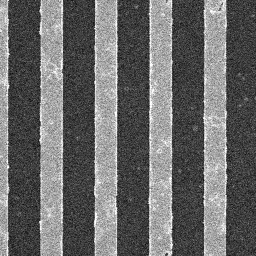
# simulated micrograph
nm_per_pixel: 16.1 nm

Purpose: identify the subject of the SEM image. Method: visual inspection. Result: parallel lines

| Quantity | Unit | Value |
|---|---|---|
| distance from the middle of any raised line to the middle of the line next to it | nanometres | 878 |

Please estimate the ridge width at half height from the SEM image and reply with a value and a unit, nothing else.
0.346 micrometres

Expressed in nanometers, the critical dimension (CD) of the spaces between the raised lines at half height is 529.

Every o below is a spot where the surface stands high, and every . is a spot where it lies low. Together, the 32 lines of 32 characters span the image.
o....ooo....ooo....oo.....oo....
o....ooo....ooo....oo.....oo....
o....ooo....ooo....ooo....oo....
o....ooo....ooo....oo.....oo....
o....ooo....ooo....oo.....oo....
o....ooo....ooo....oo.....oo....
o....ooo....ooo....oo.....oo....
o....ooo....ooo....oo.....oo....
o....ooo....ooo....oo.....oo....
o....ooo....ooo....oo.....oo....
o....ooo....ooo....oo.....oo....
o....ooo....ooo....oo.....oo....
o....ooo....ooo....oo.....oo....
o....ooo....ooo....oo.....oo....
o....ooo....ooo....oo....ooo....
o....ooo....ooo....oo.....oo....
o....ooo....ooo....oo.....oo....
o....ooo....ooo....oo.....oo....
o....ooo....ooo....oo.....oo....
o....ooo....ooo....oo.....oo....
o....ooo....ooo....oo.....oo....
o....ooo....ooo....oo.....oo....
o....ooo....ooo....oo.....oo....
o....ooo....ooo....oo.....oo....
o....ooo....ooo....oo.....oo....
o....ooo....oo.....oo.....oo....
o....ooo....ooo....oo.....oo....
o....ooo....ooo....ooo....oo....
o....ooo....ooo....oo.....oo....
o....ooo....oo.....oo.....oo....
o....ooo....ooo....ooo....oo....
o....ooo....ooo....oo.....oo....